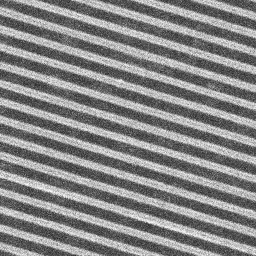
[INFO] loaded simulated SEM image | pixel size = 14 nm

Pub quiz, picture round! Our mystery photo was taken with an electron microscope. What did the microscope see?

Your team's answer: parallel lines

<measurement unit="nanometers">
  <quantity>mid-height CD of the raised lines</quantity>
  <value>86.9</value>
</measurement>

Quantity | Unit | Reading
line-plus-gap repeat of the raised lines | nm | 242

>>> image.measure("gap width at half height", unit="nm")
151